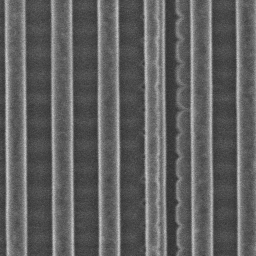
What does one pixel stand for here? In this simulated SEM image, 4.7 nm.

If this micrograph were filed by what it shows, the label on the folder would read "wiring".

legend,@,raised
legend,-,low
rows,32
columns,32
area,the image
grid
-@@----@@---@@@---@@----@@----@@
-@@----@@---@@@---@@----@@----@@
-@@----@@---@@@---@@----@@----@@
-@@----@@---@@@---@@----@@----@@
-@@----@@---@@@---@@----@@----@@
-@@----@@---@@@---@@----@@----@@
-@@----@@---@@@---@@----@@----@@
-@@----@@---@@@---@@----@@----@@
-@@----@@---@@@---@@----@@----@@
-@@----@@---@@@---@@----@@----@@
-@@----@@---@@@---@@----@@----@@
-@@----@@---@@@---@@----@@----@@
-@@----@@---@@@---@@----@@----@@
-@@----@@---@@@---@@----@@----@@
-@@----@@---@@@---@@----@@----@@
-@@----@@---@@@---@@----@@----@@
-@@----@@---@@@---@@----@@----@@
-@@----@@---@@@---@@----@@----@@
-@@----@@---@@@---@@----@@----@@
-@@----@@---@@@---@@----@@----@@
-@@----@@---@@@---@@----@@----@@
-@@----@@----@@---@@----@@----@@
-@@----@@----@@---@@----@@----@@
-@@----@@----@@---@@----@@----@@
-@@----@@----@@---@@----@@----@@
-@@----@@----@@---@@----@@----@@
-@@----@@----@@---@@----@@----@@
-@@----@@----@@---@@----@@----@@
-@@----@@----@@---@@----@@----@@
-@@----@@----@@---@@----@@----@@
-@@----@@----@@---@@----@@----@@
-@@----@@----@@---@@----@@----@@